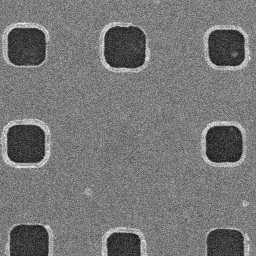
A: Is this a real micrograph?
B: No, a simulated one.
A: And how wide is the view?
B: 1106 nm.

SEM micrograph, holes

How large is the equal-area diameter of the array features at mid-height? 0.182 microns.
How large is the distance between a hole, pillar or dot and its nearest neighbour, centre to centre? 419 nm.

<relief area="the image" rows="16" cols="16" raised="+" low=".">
++++++++++++++++
++++++++++++++++
...++++..++++..+
...++++..++++..+
++++++++++++++++
++++++++++++++++
++++++++++++++++
++++++++++++++++
...++++++++++..+
...++++++++++..+
++++++++++++++++
++++++++++++++++
++++++++++++++++
++++++++++++++++
+..++++++++++..+
+..++++..++++..+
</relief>